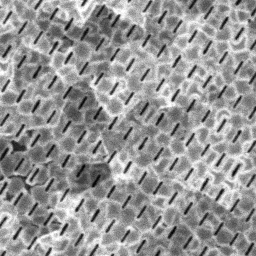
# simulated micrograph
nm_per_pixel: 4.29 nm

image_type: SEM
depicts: a regular array of holes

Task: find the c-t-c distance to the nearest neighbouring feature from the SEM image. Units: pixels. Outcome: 17.9